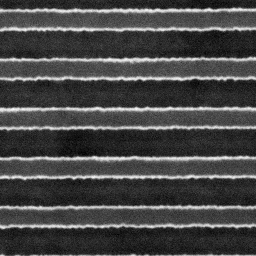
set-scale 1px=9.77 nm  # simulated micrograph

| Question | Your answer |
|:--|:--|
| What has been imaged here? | lines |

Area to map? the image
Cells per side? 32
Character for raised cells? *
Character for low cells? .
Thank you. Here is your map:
................................
********************************
********************************
********************************
................................
................................
................................
********************************
********************************
********************************
................................
................................
................................
.....................*...*..**.*
********************************
********************************
................................
................................
................................
................................
********************************
********************************
................................
................................
................................
................................
********************************
********************************
*...............................
................................
................................
................................